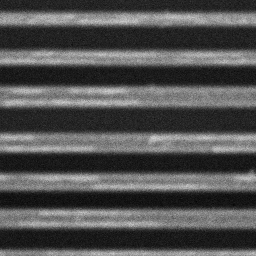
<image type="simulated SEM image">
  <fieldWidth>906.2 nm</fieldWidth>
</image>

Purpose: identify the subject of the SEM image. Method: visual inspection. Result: parallel lines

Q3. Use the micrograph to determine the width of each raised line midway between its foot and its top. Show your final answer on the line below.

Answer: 69.1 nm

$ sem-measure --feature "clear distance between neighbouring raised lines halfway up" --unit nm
71.7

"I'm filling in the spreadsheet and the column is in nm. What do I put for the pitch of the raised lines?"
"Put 142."